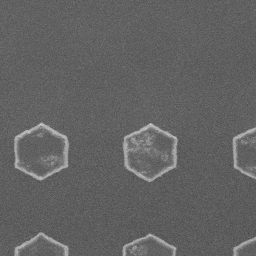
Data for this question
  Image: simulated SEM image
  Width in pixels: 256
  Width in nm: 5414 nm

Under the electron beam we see raised bodies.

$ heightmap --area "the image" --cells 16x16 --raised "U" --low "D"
DDDDDDDDDDDDDDDD
DDDDDDDDDDDDDDDD
DDDDDDDDDDDDDDDD
DDDDDDDDDDDDDDDD
DDDDDDDDDDDDDDDD
DDDDDDDDDDDDDDDD
DDDDDDDDDDDDDDDD
DDDDDDDDDDDDDDDD
DUUUDDDDUUUDDDDU
DUUUDDDDUUUDDDDU
DUUUDDDDUUUDDDDU
DDDDDDDDDDDDDDDD
DDDDDDDDDDDDDDDD
DDDDDDDDDDDDDDDD
DDDDDDDDDDDDDDDD
DUUUDDDDUUUDDDDU